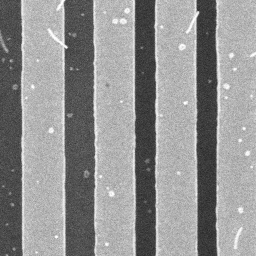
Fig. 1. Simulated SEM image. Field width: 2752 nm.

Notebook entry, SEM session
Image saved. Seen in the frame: lines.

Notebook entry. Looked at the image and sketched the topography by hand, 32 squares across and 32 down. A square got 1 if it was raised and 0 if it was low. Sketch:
00011111000011111001111100011111
00011111000011111001111110011111
00011111000011111001111110011111
00011111000011111001111100011111
00011111000011111001111100011111
00011111000011111001111100011111
00011111000011111001111100011111
00011111000011111001111100011111
00011111000011111000111100011111
00011111000011111001111100011111
00011111000011111000111100011111
00011111000011111000111100011111
00011111000011111001111100011111
00011111000011111001111110011111
00011111000011111001111110011111
00011111000011111001111110011111
00011111000011111000111110011111
00011111000011111000111100011111
00011111000011111000111100011111
00011111000011111001111110011111
00011111000011111001111110011111
00011111000011111001111110011111
00011111000011111001111110011111
00011111000011111001111110011111
00011111000011111000111110011111
00011111000011111001111110011111
00011111000011111000111110011111
00011111000011111000111110011111
00011111000011111000111110011111
00011111000011111000111110011111
00011111000011111000111110011111
00011111000011111000111110011111